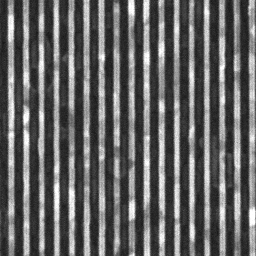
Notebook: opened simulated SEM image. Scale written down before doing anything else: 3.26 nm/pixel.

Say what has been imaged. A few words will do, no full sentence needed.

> parallel lines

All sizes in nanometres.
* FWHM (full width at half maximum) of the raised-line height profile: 15.9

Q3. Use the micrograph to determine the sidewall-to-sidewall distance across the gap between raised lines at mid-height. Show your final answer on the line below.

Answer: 10.9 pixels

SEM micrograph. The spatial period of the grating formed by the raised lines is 0.0491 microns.